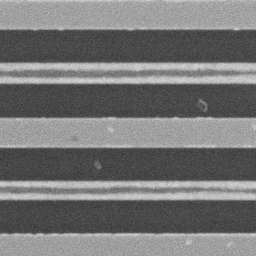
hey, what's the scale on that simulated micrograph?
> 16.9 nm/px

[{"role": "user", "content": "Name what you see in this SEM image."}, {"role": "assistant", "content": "lines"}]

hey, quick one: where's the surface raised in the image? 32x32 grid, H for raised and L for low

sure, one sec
HHHHHHHHHHHHHHHHHHHHHHHHHHHHHHHH
HHHHHHHHHHHHHHHHHHHHHHHHHHHHHHHH
HHHHHHHHHHHHHHHHHHHHHHHHHHHHHHHH
HHHHHHHHHHHHHHHHHHHHHHHHHHHHHHHH
LLLLLLLLLLLLLLLLLLLLLLLLLLLLLLLL
LLLLLLLLLLLLLLLLLLLLLLLLLLLLLLLL
LLLLLLLLLLLLLLLLLLLLLLLLLLLLLLLL
LLLLLLLLLLLLLLLLLLLLLLLLLLLLLLLL
HHHHHHHHHHHHHHHHHHHHHHHHHHHHHHHH
HHHHHHHHHHHHHHHHHHHHHHHHHHHHHHHH
LLLLLLLLLLLLLLLLLLLLLLLLLLLLLLLL
LLLLLLLLLLLLLLLLLLLLLLLLLLLLLLLL
LLLLLLLLLLLLLLLLLLLLLLLLLLLLLLLL
LLLLLLLLLLLLLLLLLLLLLLLLLLLLLLLL
LLLLLLLLLLLLLLLLLLLLLLLLLLLLLLLL
HHHHHHHHHHHHHHHHHHHHHHHHHHHHHHHH
HHHHHHHHHHHHHHHHHHHHHHHHHHHHHHHH
HHHHHHHHHHHHHHHHHHHHHHHHHHHHHHHH
LLLLLLLLLLLLLLLLLLLLLLLLLLLLLLLL
LLLLLLLLLLLLLLLLLLLLLLLLLLLLLLLL
LLLLLLLLLLLLLLLLLLLLLLLLLLLLLLLL
LLLLLLLLLLLLLLLLLLLLLLLLLLLLLLLL
LLLLLLLLLLLLLLLLLLLLLLLLLLLLLLLL
HHHHHHHHHHHHHHHHHHHHHHHHHHHHHHHH
HHHHHHHHHHHHHHHHHHHHHHHHHHHHHHHH
LLLLLLLLLLLLLLLLLLLLLLLLLLLLLLLL
LLLLLLLLLLLLLLLLLLLLLLLLLLLLLLLL
LLLLLLLLLLLLLLLLLLLLLLLLLLLLLLLL
LLLLLLLLLLLLLLLLLLLLLLLLLLLLLLLL
HHHHHHHHHHHHHHHHHHHHHHHHHHHHHHHH
HHHHHHHHHHHHHHHHHHHHHHHHHHHHHHHH
HHHHHHHHHHHHHHHHHHHHHHHHHHHHHHHH